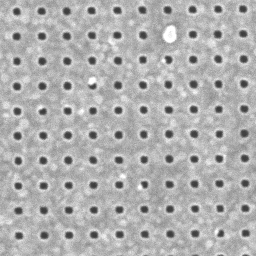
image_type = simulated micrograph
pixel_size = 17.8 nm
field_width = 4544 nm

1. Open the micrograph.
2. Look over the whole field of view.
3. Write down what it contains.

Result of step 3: a regular array of holes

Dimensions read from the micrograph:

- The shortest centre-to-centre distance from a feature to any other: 438 nm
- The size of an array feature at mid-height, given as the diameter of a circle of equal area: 0.163 micrometres